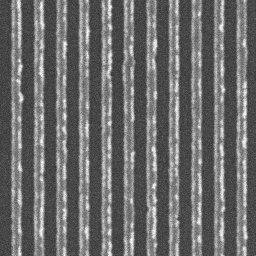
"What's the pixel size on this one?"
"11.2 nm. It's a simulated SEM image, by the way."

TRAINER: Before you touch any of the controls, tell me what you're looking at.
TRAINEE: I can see parallel lines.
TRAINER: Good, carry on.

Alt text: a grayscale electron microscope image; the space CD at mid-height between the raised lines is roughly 0.159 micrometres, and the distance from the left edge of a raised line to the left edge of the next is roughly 252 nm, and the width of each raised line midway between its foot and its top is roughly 96.3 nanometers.